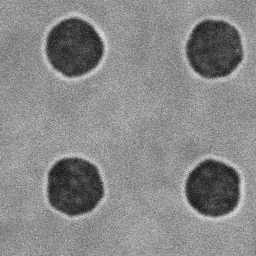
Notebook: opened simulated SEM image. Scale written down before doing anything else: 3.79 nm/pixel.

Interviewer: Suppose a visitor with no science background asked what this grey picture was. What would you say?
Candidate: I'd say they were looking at holes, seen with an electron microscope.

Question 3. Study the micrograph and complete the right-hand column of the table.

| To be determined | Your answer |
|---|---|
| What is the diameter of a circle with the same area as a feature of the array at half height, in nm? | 223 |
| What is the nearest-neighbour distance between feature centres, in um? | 0.526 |